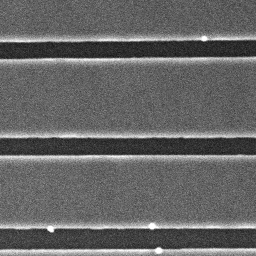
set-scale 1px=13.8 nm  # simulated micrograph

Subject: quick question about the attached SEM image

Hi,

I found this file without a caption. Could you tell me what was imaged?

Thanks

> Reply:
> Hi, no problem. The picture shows lines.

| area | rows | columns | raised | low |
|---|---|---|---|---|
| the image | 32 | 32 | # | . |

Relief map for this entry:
################################
################################
################################
################################
################################
................................
................................
################################
################################
################################
################################
################################
################################
################################
################################
################################
################################
................................
................................
......##########################
################################
################################
################################
################################
################################
################################
################################
################################
......#...........##............
................................
................................
################################